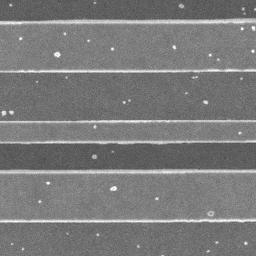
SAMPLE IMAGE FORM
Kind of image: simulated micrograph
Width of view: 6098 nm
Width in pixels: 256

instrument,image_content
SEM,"lines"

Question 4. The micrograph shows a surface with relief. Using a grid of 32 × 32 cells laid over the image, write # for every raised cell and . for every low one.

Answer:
................................
................................
................................
################################
################################
################################
################################
################################
################################
................................
................................
................................
................................
................................
................................
################################
################################
################################
................................
................................
................................
.............###################
################################
################################
################################
################################
################################
################################
................................
................................
................................
................................